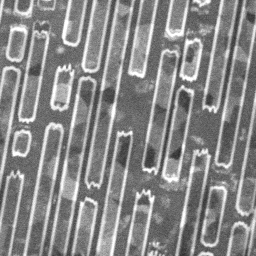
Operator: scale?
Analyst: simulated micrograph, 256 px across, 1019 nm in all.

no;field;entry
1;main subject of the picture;parallel lines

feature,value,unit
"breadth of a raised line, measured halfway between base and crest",0.0622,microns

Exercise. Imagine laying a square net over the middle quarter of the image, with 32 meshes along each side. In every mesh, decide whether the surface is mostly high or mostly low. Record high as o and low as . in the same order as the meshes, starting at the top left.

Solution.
.....ooo..oooo...ooo....oooo..oo
oo...ooo..oooo...ooo....oooo.ooo
oo........oooo....oo....oooo.ooo
oo........oooo..........ooo...oo
oo..oooo..oooo.........oooo.....
oo..oooo..ooo..........oooo.....
o...ooo..oooo..........oooo..oo.
o..oooo..oooo..........oooo.oooo
o..oooo..oooo..........oooo.oooo
o..oooo..oooo..........ooo..oooo
o..oooo..oooo.........oooo..oooo
...oooo.oooo..........oooo..ooo.
..oooo..oooo..........oooo.oooo.
..oooo..oooo..........oooo.oooo.
..oooo..oooo..........oooo.oooo.
..oooo..oooo..........ooo..oooo.
..oooo..ooo..........oooo..oooo.
..ooo..oooo...o.o....oooo..ooo..
.oooo..oooo...ooo....oooo.oooo..
.oooo..oooo..oooo....oooo.oooo..
.oooo..oooo..oooo....ooo..oooo..
.oooo..oooo..ooo....oooo..oooo..
.oooo..ooo...ooo....oooo..ooo...
.ooo..oooo...ooo....oooo.oooo...
oooo..oooo..oooo....oooo.oooo...
oooo..oooo..oooo....oooo.oooo...
oooo..oooo..ooo......o...oooo...
oooo..ooo...ooo..........oooo...
ooo..oooo...ooo..........ooo....
ooo...ooo...ooo................o
ooo.....o..oooo................o
ooo........oooo................o